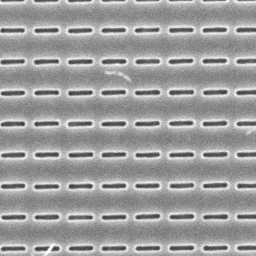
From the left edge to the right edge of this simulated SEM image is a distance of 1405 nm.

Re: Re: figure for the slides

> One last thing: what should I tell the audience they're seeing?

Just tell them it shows a regular array of holes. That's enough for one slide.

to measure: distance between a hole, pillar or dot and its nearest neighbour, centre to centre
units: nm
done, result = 170